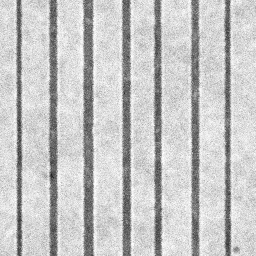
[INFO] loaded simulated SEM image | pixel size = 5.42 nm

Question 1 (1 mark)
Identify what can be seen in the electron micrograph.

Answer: parallel lines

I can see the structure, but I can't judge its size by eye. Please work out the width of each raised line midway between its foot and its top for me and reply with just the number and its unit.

140 nanometres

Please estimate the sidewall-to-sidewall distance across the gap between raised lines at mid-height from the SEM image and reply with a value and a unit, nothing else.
48.1 nm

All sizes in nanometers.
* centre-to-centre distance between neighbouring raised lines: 191